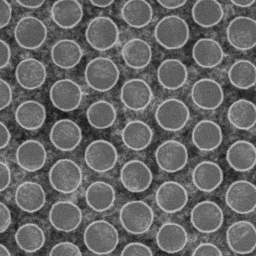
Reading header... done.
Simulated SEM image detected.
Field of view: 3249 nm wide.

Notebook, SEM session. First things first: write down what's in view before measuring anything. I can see a regular array of raised bodies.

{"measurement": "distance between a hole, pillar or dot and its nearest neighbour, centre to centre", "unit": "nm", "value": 512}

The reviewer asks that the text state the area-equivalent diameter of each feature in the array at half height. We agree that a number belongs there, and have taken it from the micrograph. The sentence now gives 0.378 µm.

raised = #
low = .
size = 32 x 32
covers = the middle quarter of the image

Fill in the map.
##....#######....###....######..
......#######...........######..
......#######...........#######.
......#######...........######..
##....#######...####....######..
###....#####...######....####...
####.....#.....######...........
####...........#######..........
####..........########..........
####...........######....####...
###....#####....####....######..
#.....######...........########.
......#######..........########.
......#######..........########.
##.....#####.....##.....######..
###.....###.....#####...######..
####...........#######..........
####...........#######..........
####...........#######..........
####....##.....######.....##....
###...######....####....######..
......#######..........#######..
......#######..........########.
......#######..........########.
##....#######....##....#######..
###....#####...#####....######..
####....##.....######.....##....
####..........########..........
####...........#######..........
####...........######...........
###....####....######...#####...
##....######.....##.....######..